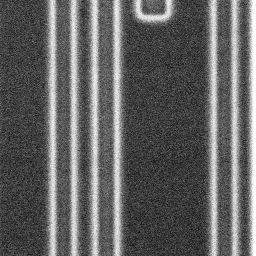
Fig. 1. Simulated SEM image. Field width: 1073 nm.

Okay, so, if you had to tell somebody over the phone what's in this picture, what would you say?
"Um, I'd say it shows groups of lines, slits or small figures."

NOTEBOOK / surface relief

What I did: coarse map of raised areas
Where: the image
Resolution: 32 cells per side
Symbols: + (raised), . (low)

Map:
+++++++..+++...++....++++++..+++
+++++++..+++...+++...++++++..+++
+++++++..+++...++++++++++++..+++
+++++++..+++...++++++++++++..+++
+++++++..+++...++++++++++++..+++
+++++++..+++...++++++++++++..+++
+++++++..+++...++++++++++++..+++
+++++++..+++...++++++++++++..+++
+++++++..+++...++++++++++++..+++
+++++++..+++...++++++++++++..+++
+++++++..+++...++++++++++++..+++
+++++++..+++...++++++++++++..+++
+++++++..+++...++++++++++++..+++
+++++++..+++...++++++++++++..+++
+++++++..+++...++++++++++++..+++
+++++++..+++...++++++++++++..+++
+++++++..+++...++++++++++++..+++
+++++++..+++...++++++++++++..+++
+++++++..+++...++++++++++++..+++
+++++++..+++...++++++++++++..+++
+++++++..+++...++++++++++++..+++
+++++++..+++...++++++++++++..+++
+++++++..+++...++++++++++++..+++
+++++++..+++...++++++++++++..+++
+++++++..+++...++++++++++++..+++
+++++++..+++...++++++++++++..+++
+++++++..+++...++++++++++++..+++
+++++++..+++...++++++++++++..+++
+++++++..+++...++++++++++++..+++
+++++++..+++...++++++++++++..+++
+++++++..+++...++++++++++++..+++
+++++++..+++...++++++++++++..+++